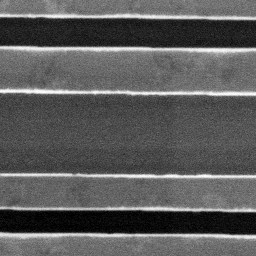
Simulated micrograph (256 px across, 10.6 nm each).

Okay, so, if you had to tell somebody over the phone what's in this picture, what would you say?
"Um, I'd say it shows lines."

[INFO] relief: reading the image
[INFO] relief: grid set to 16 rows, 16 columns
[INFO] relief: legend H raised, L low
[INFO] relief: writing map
HHHHHHHHHHHHHHHH
LLLLLLLLLLLLLLLL
LLLLLLLLLLLLLLLL
HHHHHHHHHHHHHHHH
HHHHHHHHHHHHHHHH
HHHHHHHHHHHHHHHH
LLLLLLLLLLLLLLLL
LLLLLLLLLLLLLLLL
LLLLLLLLLLLLLLLL
LLLLLLLLLLLLLLLL
LLLLLLLLLLLLLLLL
HHHHHHHHHHHHHHHH
HHHHHHHHHHHHHHHH
LLLLLLLLLLLLLLLL
LLLLLLLLLLLLLLLL
HHHHHHHHHHHHHHHH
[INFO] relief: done